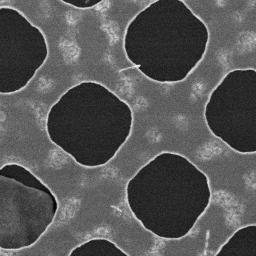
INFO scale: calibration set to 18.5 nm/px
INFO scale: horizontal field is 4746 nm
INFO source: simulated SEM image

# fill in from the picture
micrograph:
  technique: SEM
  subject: holes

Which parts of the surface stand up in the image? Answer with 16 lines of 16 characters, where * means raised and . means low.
*********...****
..******.....***
...*****.....***
...*****.....***
..*******...***.
.****..*******..
***.....*****...
***.....*****...
***.....******..
****...********.
.********...****
...*****.....***
...*****.....***
...******...****
...*******..***.
.****..*******..